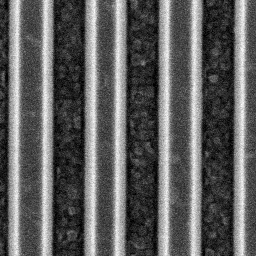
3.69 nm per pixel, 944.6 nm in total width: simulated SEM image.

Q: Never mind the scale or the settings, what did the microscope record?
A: one or a few lines or trenches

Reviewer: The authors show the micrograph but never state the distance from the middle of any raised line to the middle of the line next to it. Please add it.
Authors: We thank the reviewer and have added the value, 74.8 px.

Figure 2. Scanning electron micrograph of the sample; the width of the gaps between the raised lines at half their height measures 151 nm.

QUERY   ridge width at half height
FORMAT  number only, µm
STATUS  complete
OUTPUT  0.126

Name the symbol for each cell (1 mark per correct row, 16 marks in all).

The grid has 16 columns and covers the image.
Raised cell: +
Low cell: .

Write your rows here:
.++...++..++...+
.++...++..++...+
.++...++..++...+
.++...++..++...+
.++...++..++...+
.++...++..++...+
.++...++..++...+
.++...++..++...+
.++...++..++...+
.++...++..++...+
.++...++..++...+
.++...++..++...+
.++...++..++...+
.++...++..++...+
.++...++..++...+
.++...+...++...+